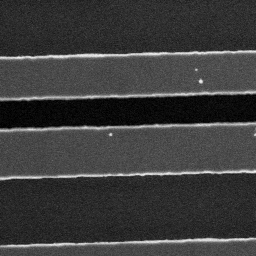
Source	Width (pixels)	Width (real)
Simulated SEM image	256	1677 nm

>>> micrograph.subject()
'lines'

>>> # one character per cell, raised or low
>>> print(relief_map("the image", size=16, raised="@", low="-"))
----------------
----------------
----------------
-----@@@@@@@@@@@
@@@@@@@@@@@@@@@@
@@@@@@@@@@@@@@@@
----------------
----------------
@@@@@@@@@@@@@@@@
@@@@@@@@@@@@@@@@
@@@@@@@@@@@@@@@@
----------------
----------------
----------------
----------------
@@@@@@@@@@@@@@@@